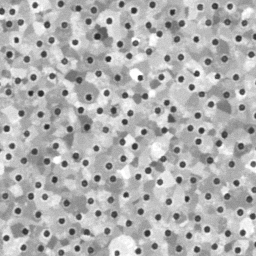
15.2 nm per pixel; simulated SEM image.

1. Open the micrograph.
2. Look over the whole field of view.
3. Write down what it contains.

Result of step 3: a regular array of holes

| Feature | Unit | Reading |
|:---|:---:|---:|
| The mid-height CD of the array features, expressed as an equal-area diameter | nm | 111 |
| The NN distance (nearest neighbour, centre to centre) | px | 15.7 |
